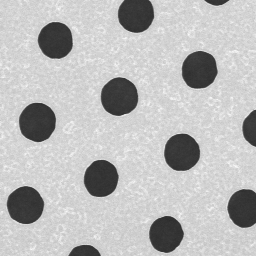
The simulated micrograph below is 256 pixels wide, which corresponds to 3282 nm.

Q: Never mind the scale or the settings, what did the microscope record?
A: a regular array of holes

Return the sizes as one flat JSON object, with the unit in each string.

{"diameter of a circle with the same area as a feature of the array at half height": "471 nanometres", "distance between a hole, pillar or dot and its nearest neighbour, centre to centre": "1070 nm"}